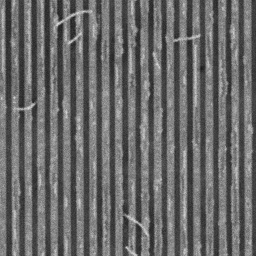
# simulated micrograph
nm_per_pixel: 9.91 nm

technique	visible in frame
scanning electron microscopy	parallel lines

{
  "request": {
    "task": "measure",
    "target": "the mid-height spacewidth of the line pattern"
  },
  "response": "63.2 nanometers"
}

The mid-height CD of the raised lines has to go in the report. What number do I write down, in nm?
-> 71.8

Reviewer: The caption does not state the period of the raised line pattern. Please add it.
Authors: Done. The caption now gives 12.9 px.